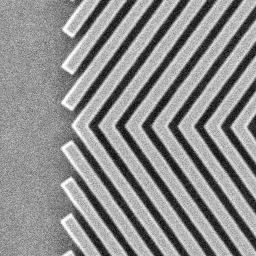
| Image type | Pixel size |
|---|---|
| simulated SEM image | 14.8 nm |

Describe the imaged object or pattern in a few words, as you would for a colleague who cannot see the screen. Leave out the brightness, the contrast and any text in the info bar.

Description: groups of lines, slits or small figures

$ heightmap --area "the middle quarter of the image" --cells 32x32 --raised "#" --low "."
####..####...####...####..####..
.##...###...####...####...###...
.....####...###...####...###...#
....####...####...###...####...#
....###...####...###...####...##
...###...####...####...###...###
..####...###...####...####..####
.####...####...###...####...###.
.###...####...####...###...####.
####...###...####...###...####..
.##...###...####...####...###...
.....####...###...####...###...#
....####...####..####...####...#
....###...####...###...####...##
...###...####...####...###...###
..####...###...####...####...###
...###...####...####...###...###
....###...####...###...####...##
....####...####...###...####...#
.....####...###...####...###...#
###...###...####...###....###...
####..####...####...###...####..
.###...####...###...####...####.
.####...###...####...####..####.
..####...###...####...###...####
...###...####...####..####...###
...####...####...###...####...##
....####...###...####...###...##
.....###...####...####...###...#
.##...###...####...###...####...
###...####...###...####...####..
.###...####...###...####...###..